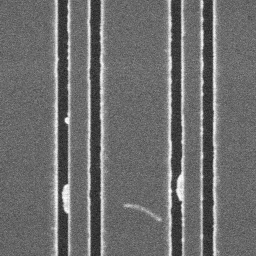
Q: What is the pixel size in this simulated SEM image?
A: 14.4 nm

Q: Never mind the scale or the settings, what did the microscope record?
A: lines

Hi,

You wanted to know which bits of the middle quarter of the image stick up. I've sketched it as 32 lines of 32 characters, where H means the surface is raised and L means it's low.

LHHHHHLLLHHHHHHHHHHHHHHHHHHLLHHH
LHHHHHLLLHHHHHHHHHHHHHHHHHHLLHHH
LHHHHHLLLHHHHHHHHHHHHHHHHHHLLHHH
LHHHHHLLLHHHHHHHHHHHHHHHHHHLLHHH
LHHHHHLLLHHHHHHHHHHHHHHHHHHLLHHH
LHHHHHLLLHHHHHHHHHHHHHHHHHHLLHHH
LHHHHHLLLHHHHHHHHHHHHHHHHHHLLHHH
LHHHHHLLLHHHHHHHHHHHHHHHHHHLLHHH
LHHHHHLLLHHHHHHHHHHHHHHHHHHLLHHH
LHHHHHLLLHHHHHHHHHHHHHHHHHHLLHHH
LHHHHHLLLHHHHHHHHHHHHHHHHHHLLHHH
LHHHHHLLLHHHHHHHHHHHHHHHHHHLLHHH
LHHHHHLLLHHHHHHHHHHHHHHHHHHLLHHH
LHHHHHLLLHHHHHHHHHHHHHHHHHHLLHHH
LHHHHHLLLHHHHHHHHHHHHHHHHHHLLHHH
LHHHHHLLLHHHHHHHHHHHHHHHHHHLLHHH
LHHHHHLLLHHHHHHHHHHHHHHHHHHLLLHH
LHHHHHLLLHHHHHHHHHHHHHHHHHHLLHHH
LHHHHHLLLHHHHHHHHHHHHHHHHHHLLLHH
LHHHHHLLLHHHHHHHHHHHHHHHHHHLLHHH
LHHHHHLLLHHHHHHHHHHHHHHHHHHLLLHH
LHHHHHLLLHHHHHHHHHHHHHHHHHHLLLHH
LHHHHHLLLHHHHHHHHHHHHHHHHHHLLLHH
LHHHHHLLLHHHHHHHHHHHHHHHHHHLLHHH
LHHHHHLLLHHHHHHHHHHHHHHHHHHLLHHH
LHHHHHLLLHHHHHHHHHHHHHHHHHHLLHHH
LHHHHHLLLHHHHHHHHHHHHHHHHHHLLHHH
LHHHHHLLLHHHHHHHHHHHHHHHHHHLLHHH
LHHHHHLLLHHHHHHHHHHHHHHHHHHLLHHH
LHHHHHLLLHHHHHHHHHHHHHHHHHHLLLHH
LHHHHHLLLHHHHHHHHHHHHHHHHHHLLLHH
LHHHHHLLLHHHHHHHHHHHHHHHHHHLLLHH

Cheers